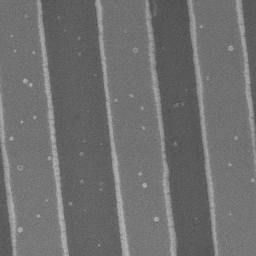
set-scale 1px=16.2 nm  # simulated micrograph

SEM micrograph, lines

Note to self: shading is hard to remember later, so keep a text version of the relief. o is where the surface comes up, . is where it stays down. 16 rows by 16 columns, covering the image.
ooo...ooo...ooo.
ooo...ooo...ooo.
ooo...ooo...ooo.
ooo...oooo..ooo.
ooo...oooo..ooo.
ooo....ooo..oooo
ooo....ooo..oooo
ooo....ooo...ooo
ooo....ooo...ooo
ooo....ooo...ooo
oooo...ooo...ooo
oooo...ooo...ooo
.ooo...oooo..ooo
.ooo....ooo..ooo
.ooo....ooo..ooo
.ooo....ooo..ooo